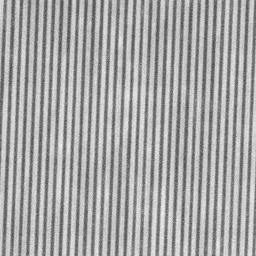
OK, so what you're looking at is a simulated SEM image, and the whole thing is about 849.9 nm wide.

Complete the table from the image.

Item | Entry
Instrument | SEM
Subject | parallel lines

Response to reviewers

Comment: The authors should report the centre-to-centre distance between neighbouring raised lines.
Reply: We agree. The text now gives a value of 26.8 nanometers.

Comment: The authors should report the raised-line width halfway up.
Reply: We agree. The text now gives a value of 13.7 nanometers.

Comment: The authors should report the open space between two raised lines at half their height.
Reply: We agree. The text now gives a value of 0.0137 um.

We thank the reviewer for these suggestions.